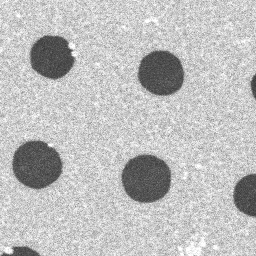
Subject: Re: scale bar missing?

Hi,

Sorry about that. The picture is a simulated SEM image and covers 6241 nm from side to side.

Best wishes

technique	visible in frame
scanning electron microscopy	holes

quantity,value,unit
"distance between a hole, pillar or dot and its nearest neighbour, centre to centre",2620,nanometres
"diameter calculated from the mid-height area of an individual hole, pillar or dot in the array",1170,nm